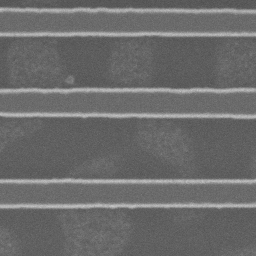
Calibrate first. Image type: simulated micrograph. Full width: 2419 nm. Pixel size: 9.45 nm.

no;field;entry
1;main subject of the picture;lines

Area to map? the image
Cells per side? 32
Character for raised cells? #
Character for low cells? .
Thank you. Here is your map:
................................
################################
################################
################################
................................
................................
................................
................................
................................
................................
................................
################################
################################
################################
.##...##########################
................................
................................
................................
................................
................................
................................
................................
................................
################################
################################
################################
................................
................................
................................
................................
................................
................................